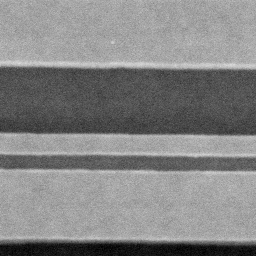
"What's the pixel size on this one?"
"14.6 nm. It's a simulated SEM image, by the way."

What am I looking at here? lines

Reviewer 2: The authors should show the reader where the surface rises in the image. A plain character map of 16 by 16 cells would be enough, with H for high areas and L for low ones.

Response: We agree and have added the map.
HHHHHHHHHHHHHHHH
HHHHHHHHHHHHHHHH
HHHHHHHHHHHHHHHH
HHHHHHHHHHHHHHHH
LLLLLLLLLLLLLLLL
LLLLLLLLLLLLLLLL
LLLLLLLLLLLLLLLL
LLLLLLLLLLLLLLLL
HHHHHHHHHHHHLLLL
HHHHHHHHHHHHHHHH
HHHHHHHHHHHHHHHH
HHHHHHHHHHHHHHHH
HHHHHHHHHHHHHHHH
HHHHHHHHHHHHHHHH
HHHHHHHHHHHHHHHH
LLLLLLLLLLLLLLLL